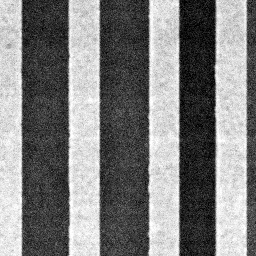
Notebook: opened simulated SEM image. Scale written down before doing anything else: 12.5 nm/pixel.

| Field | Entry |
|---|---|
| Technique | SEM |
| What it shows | lines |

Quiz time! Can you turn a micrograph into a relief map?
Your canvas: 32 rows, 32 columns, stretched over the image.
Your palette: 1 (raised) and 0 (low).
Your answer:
11100000011100000001110000011110
11100000011100000001110000011110
11100000011100000001110000011110
11100000011100000001110000011110
11100000011100000001110000011110
11100000011100000001110000011110
11100000011100000001110000011110
11100000011100000001110000011110
11100000011100000001110000011110
11100000011100000001110000011110
11100000011100000001110000011110
11100000011100000001110000011110
11100000011100000001110000011110
11100000011100000001110000011110
11100000011100000001110000011110
11100000011100000001110000011110
11100000011100000001110000011110
11100000011100000001110000011110
11100000011100000001110000011110
11100000011100000001110000011110
11100000011100000001110000011110
11100000011100000001110000011110
11100000011100000001110000011110
11100000011100000001110000011110
11100000011100000001110000011110
11100000011100000001110000011110
11100000011100000001110000011110
11100000011100000001110000011110
11100000011100000001110000011110
11100000011100000001110000011110
11100000011100000001110000011110
11100000011100000001110000011110